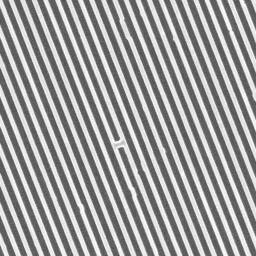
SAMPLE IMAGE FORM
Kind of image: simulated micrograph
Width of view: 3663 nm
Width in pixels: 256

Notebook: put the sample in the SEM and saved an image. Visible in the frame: parallel lines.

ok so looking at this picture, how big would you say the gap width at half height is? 93.3 nm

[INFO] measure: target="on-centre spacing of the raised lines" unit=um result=0.154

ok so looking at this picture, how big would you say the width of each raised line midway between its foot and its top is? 53.3 nm